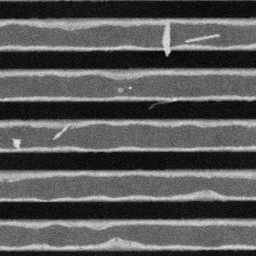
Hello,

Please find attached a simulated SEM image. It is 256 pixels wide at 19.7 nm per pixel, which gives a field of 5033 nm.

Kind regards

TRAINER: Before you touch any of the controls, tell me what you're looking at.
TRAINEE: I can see lines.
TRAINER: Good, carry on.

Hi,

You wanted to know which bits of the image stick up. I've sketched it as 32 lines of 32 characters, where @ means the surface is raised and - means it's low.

--------------------------------
--------------------------------
-@-----------@--@@@@@@@@@@@@@@@@
@@@@@@@@@@@@@@@@@@@@@@@@@@@@@@@@
@@@@@@@@@@@@@@@@@@@@@@@@@@@@@@@@
@@@@@@@@@@@@@@@@@@@@@@@@@@@@@@@@
--------------------@-----------
--------------------------------
--------------------------------
@@@@@@@@@@@@@@@@@@@@@@@@@@@@@@@@
@@@@@@@@@@@@@@@@@@@@@@@@@@@@@@@@
@@@@@@@@@@@@@@@@@@@@@@@@@@@@@@@@
@@@@@@@@@@@@@@@@@@@@@@@@@@-@--@@
--------------------------------
--------------------------------
@@@@@@@@@@@@@@@@@@@@@@@@@@@@@@@@
@@@@@@@@@@@@@@@@@@@@@@@@@@@@@@@@
@@@@@@@@@@@@@@@@@@@@@@@@@@@@@@@@
@@@@@@@@@@@@@@@@@@@@@@@@@@@@@@@@
--------------------------------
--------------------------------
-----@@@@@@@@@@@@@@@@@@@@@@@@@@@
@@@@@@@@@@@@@@@@@@@@@@@@@@@@@@@@
@@@@@@@@@@@@@@@@@@@@@@@@@@@@@@@@
@@@@@@@@@@@@@@@@@@@@@@@@@@@@@@@@
--------------------------------
--------------------------------
--------------------------@@@---
@@@@@@@@@@@@@@@@@@@@@@@@@@@@@@@@
@@@@@@@@@@@@@@@@@@@@@@@@@@@@@@@@
@@@@@@@@@@@@@@@@@@@@@@@@@@@@@@@@
--------------------------------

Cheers